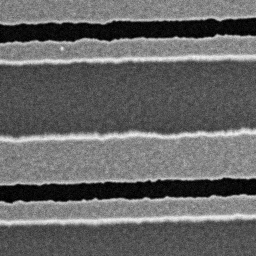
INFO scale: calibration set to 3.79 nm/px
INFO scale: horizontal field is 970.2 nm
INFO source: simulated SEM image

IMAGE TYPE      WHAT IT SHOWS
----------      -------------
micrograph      lines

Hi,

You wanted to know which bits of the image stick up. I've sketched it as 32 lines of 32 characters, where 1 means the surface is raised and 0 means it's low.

11111111111111111111111111111111
11111111111111111111111111111111
11111111111111111111111000000000
00000000000000000000000000000000
00000000000000000000000000011101
11111111111111111111111111111111
11111111111111111111111111111111
11111111111110100000000000000000
00000000000000000000000000000000
00000000000000000000000000000000
00000000000000000000000000000000
00000000000000000000000000000000
00000000000000000000000000000000
00000000000000000000000000000000
00000000000000000000000000000000
00000000000000000000000000000000
00000000000000000000000000000010
10011111111111111111111111111111
11111111111111111111111111111111
11111111111111111111111111111111
11111111111111111111111111111111
11111111111111111111111111111111
11111111111111111110000000000000
00000000000000000000000000000000
00000000000000000000000000100111
11111111111111111111111111111111
11111111111111111111111111111111
11111111111111000000000000000000
00000000000000000000000000000000
00000000000000000000000000000000
00000000000000000000000000000000
00000000000000000000000000000000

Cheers